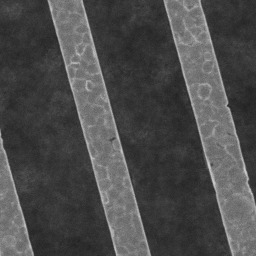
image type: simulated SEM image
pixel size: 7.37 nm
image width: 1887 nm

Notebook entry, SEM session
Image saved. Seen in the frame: one or a few lines or trenches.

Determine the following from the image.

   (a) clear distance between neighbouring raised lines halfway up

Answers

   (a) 585 nm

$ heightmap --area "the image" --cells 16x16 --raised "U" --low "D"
UDDUUDDDDDUUUDDD
DDDUUUDDDDDUUDDD
DDDDUUDDDDDUUDDD
DDDDUUDDDDDUUDDD
DDDDUUDDDDDUUUDD
DDDDUUUDDDDDUUDD
DDDDDUUDDDDDUUDD
DDDDDUUDDDDDUUUD
DDDDDUUDDDDDDUUD
DDDDDDUUDDDDDUUD
UDDDDDUUDDDDDUUD
UDDDDDUUDDDDDUUU
UDDDDDUUUDDDDDUU
UDDDDDDUUDDDDDUU
UUDDDDDUUDDDDDUU
UUDDDDDUUDDDDDUU